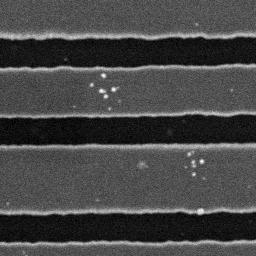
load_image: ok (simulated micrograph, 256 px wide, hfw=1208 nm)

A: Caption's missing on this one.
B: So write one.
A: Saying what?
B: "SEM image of lines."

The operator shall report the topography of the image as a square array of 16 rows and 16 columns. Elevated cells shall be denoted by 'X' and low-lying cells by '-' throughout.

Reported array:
XXXXXXXXXXXXXXXX
XXXXXXXXXXXXXXXX
----------------
----------------
XXXXXXXXXXXXXXXX
XXXXXXXXXXXXXXXX
XXXXXXXXXXXXXXXX
----------------
----------------
XXXXXXXXXXXXXXXX
XXXXXXXXXXXXXXXX
XXXXXXXXXXXXXXXX
XXXXXXXXXXXXXXXX
----------------
----------------
XXXXXXXXXXXXXXXX